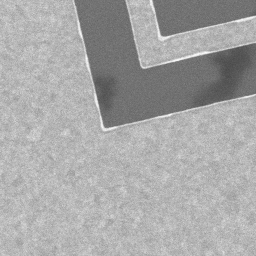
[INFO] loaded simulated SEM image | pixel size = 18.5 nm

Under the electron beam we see groups of lines, slits or small figures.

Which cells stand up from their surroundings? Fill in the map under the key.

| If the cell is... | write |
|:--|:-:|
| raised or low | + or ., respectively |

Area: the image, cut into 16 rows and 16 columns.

+++++...++......
+++++...++....++
+++++...++++++++
+++++....+++....
++++++..........
++++++..........
++++++.......+++
++++++...+++++++
++++++++++++++++
++++++++++++++++
++++++++++++++++
++++++++++++++++
++++++++++++++++
++++++++++++++++
++++++++++++++++
++++++++++++++++